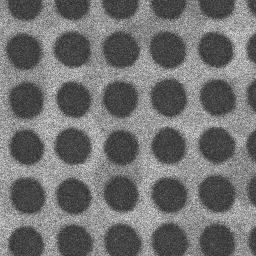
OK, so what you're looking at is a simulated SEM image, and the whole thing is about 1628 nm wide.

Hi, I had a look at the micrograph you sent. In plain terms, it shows a regular array of holes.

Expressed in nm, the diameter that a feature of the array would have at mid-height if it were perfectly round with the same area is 228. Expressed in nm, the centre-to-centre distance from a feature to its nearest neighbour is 300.